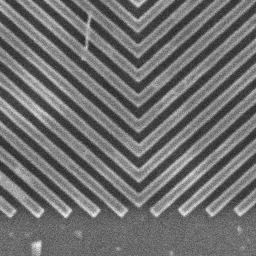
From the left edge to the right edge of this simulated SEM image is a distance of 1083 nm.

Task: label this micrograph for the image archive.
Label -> groups of lines, slits or small figures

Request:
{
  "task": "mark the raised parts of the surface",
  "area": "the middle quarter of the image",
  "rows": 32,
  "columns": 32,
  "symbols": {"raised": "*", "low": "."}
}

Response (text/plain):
***....***....***...***....***..
.****...***....*******...****...
..****...****...*****...****...*
...****...****...***...****...**
*...****...****.......****...***
**...****...****.....****...****
***...****...****...****...****.
.***....***....*******....***...
..***....****...*****....***....
...***....****...***....***....*
....****...****...*...****....**
**...****...****.....****...****
***...****...****...****...****.
****...****...****.****...****..
..***....***....*****....****...
...***....***....***....***....*
....***....***....*....***....**
**...***....****......***....***
***...****...****....***....***.
****...****...****.****...****..
.****...****...*******...****...
..****...****....****...***....*
...****....***....*....***....**
*....***....***.......***....***
**....***....***.....***....***.
***....***....***...***....***..
.****...****...*******....***...
..****...****...*****....***....
...****....***...***....***....*
*....***....***.......***....***
**....***....***.....****...***.
***....***....***...***....***..